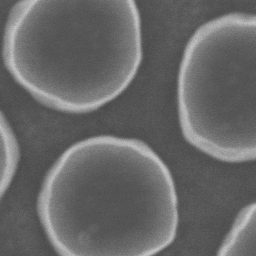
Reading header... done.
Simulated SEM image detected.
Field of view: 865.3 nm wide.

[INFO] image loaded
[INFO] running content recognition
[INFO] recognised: raised bodies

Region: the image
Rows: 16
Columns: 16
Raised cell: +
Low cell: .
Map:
.+++++++........
.++++++++....+++
.++++++++...++++
.++++++++...++++
.+++++++...+++++
..++++++...+++++
....++.....+++++
...........+++++
+...........++++
+...+++++....+++
+...++++++......
...++++++++.....
...++++++++.....
...++++++++....+
...++++++++....+
....++++++....++